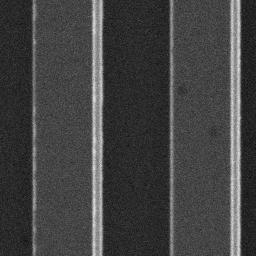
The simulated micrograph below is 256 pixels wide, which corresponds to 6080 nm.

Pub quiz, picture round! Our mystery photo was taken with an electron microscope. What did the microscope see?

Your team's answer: lines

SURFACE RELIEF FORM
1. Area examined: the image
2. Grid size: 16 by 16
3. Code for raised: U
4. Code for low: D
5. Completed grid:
DDUUUUDDDDDUUUUD
DDUUUUDDDDDUUUUD
DDUUUUDDDDDUUUUD
DDUUUUDDDDDUUUUD
DDUUUUDDDDDUUUUD
DDUUUUDDDDDUUUUD
DDUUUUDDDDDUUUUD
DDUUUUDDDDDUUUUD
DDUUUUDDDDDUUUUD
DDUUUUDDDDDUUUUD
DDUUUUDDDDDUUUUD
DDUUUUDDDDDUUUUD
DDUUUUDDDDDUUUUD
DDUUUUDDDDDUUUUD
DDUUUUDDDDDUUUUD
DDUUUUDDDDDUUUUD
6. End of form